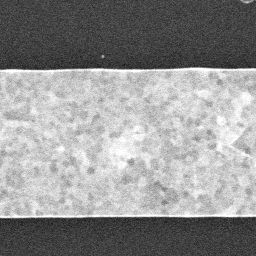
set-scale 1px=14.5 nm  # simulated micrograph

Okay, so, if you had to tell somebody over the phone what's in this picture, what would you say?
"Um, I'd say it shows wiring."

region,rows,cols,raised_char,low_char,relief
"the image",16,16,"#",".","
................
................
................
................
################
################
################
################
################
################
################
################
################
######..........
................
................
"